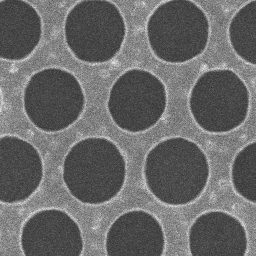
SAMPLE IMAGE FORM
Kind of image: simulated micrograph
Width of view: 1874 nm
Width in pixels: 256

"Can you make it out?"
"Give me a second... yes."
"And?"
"holes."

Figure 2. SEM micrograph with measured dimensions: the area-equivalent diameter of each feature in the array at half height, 453 nm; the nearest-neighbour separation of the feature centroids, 600 nm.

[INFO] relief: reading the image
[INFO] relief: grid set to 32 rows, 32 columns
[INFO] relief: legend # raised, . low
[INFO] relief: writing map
....######....######....#######.
.....####......####......#####..
.....###........###.......###...
.....###........##........###...
.....###.......###........###...
.....###.......####.......###...
....#####......####......####...
##########....######....#######.
################################
####.....######....######.....##
###.......####......####......##
###.......####.......###.......#
###........###.......###.......#
###.......###........###.......#
###.......####......####.......#
####.....######....######.....##
######.#########.#########..####
...#######....#######..#########
....#####......####......######.
.....###.......###........####..
.....###........##........###...
.....###........##........###...
.....###........##........###...
.....####......####......####...
....#####.....#####......#####..
###########.#########..#########
#####...########..########..####
####.....#####......#####.....##
###.......####......####......##
###.......###.......####.......#
###.......###........###.......#
###.......###.......####.......#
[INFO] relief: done